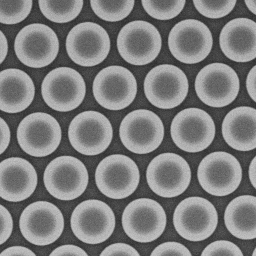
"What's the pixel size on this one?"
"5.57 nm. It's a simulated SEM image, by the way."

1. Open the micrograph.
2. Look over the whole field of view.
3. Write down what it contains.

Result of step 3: an array of small figures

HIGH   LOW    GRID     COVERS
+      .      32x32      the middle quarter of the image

.......................+++++....
+++......+++++++......+++++++...
++++....+++++++++....+++++++++..
+++++...++++++++++..+++++++++++.
+++++..+++++++++++..+++++++++++.
+++++..+++++++++++..+++++++++++.
+++++..+++++++++++..+++++++++++.
+++++..+++++++++++..+++++++++++.
+++++...++++++++++...+++++++++..
++++....+++++++++.....+++++++...
+++.......++++++.......+++++....
++................++..........++
....+++++.......+++++++.....++++
...++++++++....+++++++++....++++
..+++++++++...++++++++++...+++++
.+++++++++++..+++++++++++..+++++
.+++++++++++..+++++++++++..+++++
.+++++++++++..+++++++++++..+++++
.+++++++++++..+++++++++++..+++++
..++++++++++...+++++++++...+++++
..+++++++++....+++++++++....++++
...+++++++......+++++++.......++
.....++++...............++++....
+++.......++++++.......+++++++..
++++.....++++++++.....+++++++++.
+++++...++++++++++...++++++++++.
++++++..+++++++++++..++++++++++.
++++++..+++++++++++..+++++++++++
++++++..+++++++++++..+++++++++++
++++++..+++++++++++..++++++++++.
++++++..++++++++++...++++++++++.
+++++....+++++++++....++++++++..